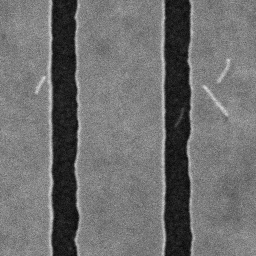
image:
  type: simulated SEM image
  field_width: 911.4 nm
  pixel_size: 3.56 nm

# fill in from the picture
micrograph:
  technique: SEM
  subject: lines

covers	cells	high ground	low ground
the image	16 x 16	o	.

ooo..ooooo..oooo
ooo..ooooo..oooo
ooo..ooooo..oooo
ooo..ooooo..oooo
ooo..ooooo..oooo
ooo..ooooo..oooo
ooo..ooooo..oooo
ooo..ooooo..oooo
ooo..ooooo..oooo
ooo..ooooo..oooo
ooo..ooooo..oooo
ooo..ooooo..oooo
ooo..ooooo..oooo
ooo..ooooo..oooo
ooo..ooooo..oooo
ooo..ooooo..oooo